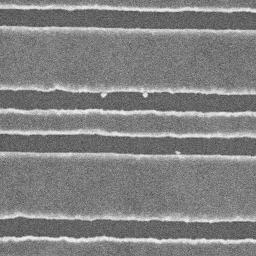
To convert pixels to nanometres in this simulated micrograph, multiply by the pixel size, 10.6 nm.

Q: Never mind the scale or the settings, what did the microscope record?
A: lines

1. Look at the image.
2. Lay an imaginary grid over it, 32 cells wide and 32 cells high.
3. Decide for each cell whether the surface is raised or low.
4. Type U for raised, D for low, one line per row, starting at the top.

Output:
UUUUUUUUUUUUUUUUUUUUUUUUUUUUUUUU
DDDDDDDDDDDDDDDDDDDDDDDDDDDDDDDD
DDDDDDDDDDDDDDDDDDDDDDDDDDDDDDDD
UDDDDDDDDDDDDDDDDDDDDDDDDDDDDDDD
UUUUUUUUUUUUUUUUUUUUUUUUUUUUUUUU
UUUUUUUUUUUUUUUUUUUUUUUUUUUUUUUU
UUUUUUUUUUUUUUUUUUUUUUUUUUUUUUUU
UUUUUUUUUUUUUUUUUUUUUUUUUUUUUUUU
UUUUUUUUUUUUUUUUUUUUUUUUUUUUUUUU
UUUUUUUUUUUUUUUUUUUUUUUUUUUUUUUU
UUUUUUUUUUUUUUUUUUUUUUUUUUUUUUUU
DDDDDDDDDDDDDDDDDDDDDDDDDUUUUUUU
DDDDDDDDDDDDDDDDDDDDDDDDDDDDDDDD
DDDDDDDDDDDDDDDDDDDDDDDDDDDDDDDD
UUUUUUUUUUUUUUUUUUUUUUUUUUUUUUUU
UUUUUUUUUUUUUUUUUUUUUUUUUUUUUUUU
UUUUUUUUUUUUUUUUUUUUUUUUUUUUUUUU
DDDDDDDDDDDDDDDDDDDDDDDDDDDDDDDD
DDDDDDDDDDDDDDDDDDDDDDDDDDDDDDDD
UUUUUUUUUUUUUUUDDDDDDDDDDDDDDDDD
UUUUUUUUUUUUUUUUUUUUUUUUUUUUUUUU
UUUUUUUUUUUUUUUUUUUUUUUUUUUUUUUU
UUUUUUUUUUUUUUUUUUUUUUUUUUUUUUUU
UUUUUUUUUUUUUUUUUUUUUUUUUUUUUUUU
UUUUUUUUUUUUUUUUUUUUUUUUUUUUUUUU
UUUUUUUUUUUUUUUUUUUUUUUUUUUUUUUU
UUUUUUUUUUUUUUUUUUUUUUUUUUUUUUUU
DDDDDDDDDDDDDDDDDDDDDDDUDUUDDDDD
DDDDDDDDDDDDDDDDDDDDDDDDDDDDDDDD
DDDDDDDDDDDDDDDDDDDDDDDDDDDDDDDD
UUUUUUUUUUUUUUUUUUUUUUUUUUUUUUUU
UUUUUUUUUUUUUUUUUUUUUUUUUUUUUUUU